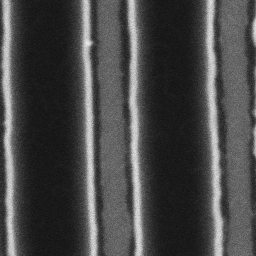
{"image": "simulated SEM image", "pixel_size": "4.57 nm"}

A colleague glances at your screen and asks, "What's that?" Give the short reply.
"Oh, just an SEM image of one or a few lines or trenches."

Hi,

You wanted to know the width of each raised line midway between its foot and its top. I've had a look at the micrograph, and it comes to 0.377 micrometres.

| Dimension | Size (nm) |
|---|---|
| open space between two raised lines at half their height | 196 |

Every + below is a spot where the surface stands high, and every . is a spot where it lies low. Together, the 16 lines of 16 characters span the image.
+++++...+++++...
+++++...+++++...
+++++...+++++...
+++++...+++++...
++++++..+++++...
++++++..+++++...
++++++..+++++...
++++++..+++++...
++++++..+++++...
++++++..++++++..
.+++++..++++++..
.+++++..++++++..
.+++++...+++++..
.+++++...+++++..
.+++++...+++++..
.+++++...+++++..